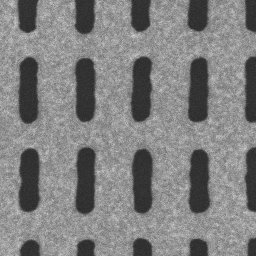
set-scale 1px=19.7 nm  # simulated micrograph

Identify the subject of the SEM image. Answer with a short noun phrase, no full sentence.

a regular array of holes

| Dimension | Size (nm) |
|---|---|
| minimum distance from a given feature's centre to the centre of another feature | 1110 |